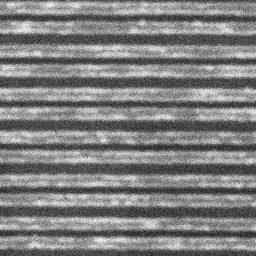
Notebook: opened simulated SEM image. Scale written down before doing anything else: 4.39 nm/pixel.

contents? parallel lines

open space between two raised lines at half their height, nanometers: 40.6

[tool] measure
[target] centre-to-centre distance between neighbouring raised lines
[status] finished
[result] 93.9 nm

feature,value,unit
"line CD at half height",48.3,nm